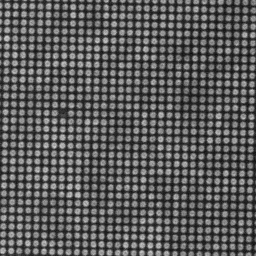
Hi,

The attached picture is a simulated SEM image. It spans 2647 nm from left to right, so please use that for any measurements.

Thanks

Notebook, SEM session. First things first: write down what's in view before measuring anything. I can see a regular array of raised bodies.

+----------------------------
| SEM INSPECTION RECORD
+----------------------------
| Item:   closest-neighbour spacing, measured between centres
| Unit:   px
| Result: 8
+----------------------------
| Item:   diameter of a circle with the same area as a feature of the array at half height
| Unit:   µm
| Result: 0.0534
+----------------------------